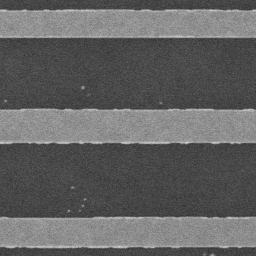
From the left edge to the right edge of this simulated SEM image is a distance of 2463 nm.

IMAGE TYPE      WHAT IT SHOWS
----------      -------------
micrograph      lines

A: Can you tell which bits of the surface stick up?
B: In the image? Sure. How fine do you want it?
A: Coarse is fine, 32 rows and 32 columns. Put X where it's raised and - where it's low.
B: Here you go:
--------------------------------
XXXXXXXXXXXXXXXXXXXXXXXXXXXXXXXX
XXXXXXXXXXXXXXXXXXXXXXXXXXXXXXXX
XXXXXXXXXXXXXXXXXXXXXXXXXXXXXXXX
XXXXXXXXXXXXXXXXXXXXXXXXXXXXXXXX
--------------------------------
--------------------------------
--------------------------------
--------------------------------
--------------------------------
--------------------------------
--------------------------------
--------------------------------
--------------------------------
XXXXXXXXXXXXXXXXXXXXXXXXXXXXXXXX
XXXXXXXXXXXXXXXXXXXXXXXXXXXXXXXX
XXXXXXXXXXXXXXXXXXXXXXXXXXXXXXXX
XXXXXXXXXXXXXXXXXXXXXXXXXXXXXXXX
--------------------------------
--------------------------------
--------------------------------
--------------------------------
--------------------------------
--------------------------------
--------------------------------
--------------------------------
--------------------------------
XXXXXXXXXXXXXXXXXXXXXXXXXXXXXXXX
XXXXXXXXXXXXXXXXXXXXXXXXXXXXXXXX
XXXXXXXXXXXXXXXXXXXXXXXXXXXXXXXX
XXXXXXXXXXXXXXXXXXXXXXXXXXXXXXXX
--------------------------------